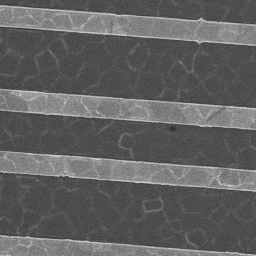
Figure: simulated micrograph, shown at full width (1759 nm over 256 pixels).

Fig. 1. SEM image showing one or a few lines or trenches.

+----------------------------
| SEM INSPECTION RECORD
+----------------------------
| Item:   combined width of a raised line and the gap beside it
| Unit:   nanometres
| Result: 496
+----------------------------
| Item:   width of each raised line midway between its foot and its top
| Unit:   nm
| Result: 139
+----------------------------